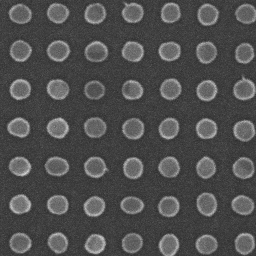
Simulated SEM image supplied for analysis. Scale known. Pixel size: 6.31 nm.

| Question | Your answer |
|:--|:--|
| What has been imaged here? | a regular array of raised bodies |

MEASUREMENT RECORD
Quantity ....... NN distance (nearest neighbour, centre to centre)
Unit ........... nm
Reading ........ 232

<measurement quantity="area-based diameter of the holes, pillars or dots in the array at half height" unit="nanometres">124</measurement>